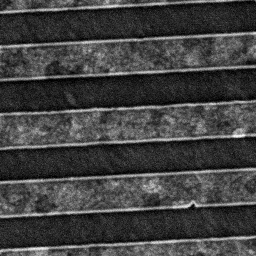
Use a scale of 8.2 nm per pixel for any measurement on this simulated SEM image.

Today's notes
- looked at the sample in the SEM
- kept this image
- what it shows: one or a few lines or trenches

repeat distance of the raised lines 557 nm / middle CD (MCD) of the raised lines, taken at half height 276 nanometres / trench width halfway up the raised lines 0.284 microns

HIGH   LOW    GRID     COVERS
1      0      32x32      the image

11111111111111111110000000000000
00000000000000000000000000000000
00000000000000000000000000000000
00000000000000000000000000000000
00000000000000000000000000111111
00000001111111111111111111111111
11111111111111111111111111111111
11111111111111111111111111111111
11111111111111111111111111100000
11111111100000000000000000000000
00000000000000000000000000000000
00000000000000000000000000000000
00000000000000000000000000000000
00000000000000001011111111111111
11111111111111111111111111111111
11111111111111111111111111111111
11111111111111111111111111111111
11111111111111111110000000000000
10000000000000000000000000000000
00000000000000000000000000000000
00000000000000000000000000000000
00000000000000000000000000111111
00000001111111111111111111111111
11111111111111111111111111111111
11111111111111111111111111111111
11111111111111111111111111110000
11111111110000000000000000000000
00000000000000000000000000000000
00000000000000000000000000000000
00000000000000000000000000000000
00000000000000000111111111111111
11111111111111111111111111111111